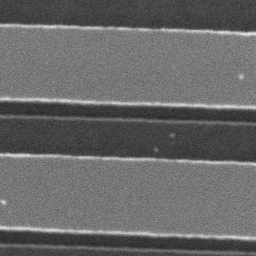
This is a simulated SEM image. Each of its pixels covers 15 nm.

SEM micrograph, lines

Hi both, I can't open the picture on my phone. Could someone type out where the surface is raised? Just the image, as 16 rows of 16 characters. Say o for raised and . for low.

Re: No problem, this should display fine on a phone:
................
................
oooooooooooooooo
oooooooooooooooo
oooooooooooooooo
oooooooooooooooo
..........oooooo
................
................
................
oooooooooooooooo
oooooooooooooooo
oooooooooooooooo
oooooooooooooooo
......oooooooooo
................